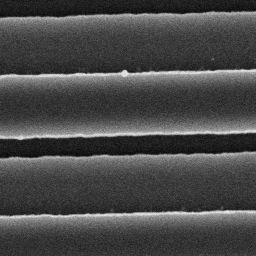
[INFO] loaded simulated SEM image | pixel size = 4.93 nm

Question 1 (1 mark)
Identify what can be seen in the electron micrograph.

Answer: lines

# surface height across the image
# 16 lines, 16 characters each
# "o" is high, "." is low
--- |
................
................
................
................
..........oooooo
oooooooooooooooo
oooooooooooooooo
oooooooooooooooo
oooooo..........
................
................
................
................
oooooooooooooooo
oooooooooooooooo
oooooooooooooooo